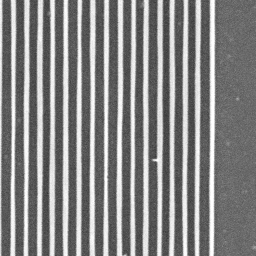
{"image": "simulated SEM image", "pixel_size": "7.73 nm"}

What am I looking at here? parallel lines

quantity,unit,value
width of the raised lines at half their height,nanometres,28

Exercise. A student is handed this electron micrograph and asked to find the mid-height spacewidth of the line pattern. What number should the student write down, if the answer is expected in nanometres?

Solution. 74.4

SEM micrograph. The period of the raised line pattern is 102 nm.